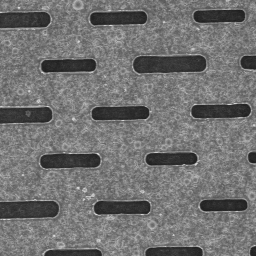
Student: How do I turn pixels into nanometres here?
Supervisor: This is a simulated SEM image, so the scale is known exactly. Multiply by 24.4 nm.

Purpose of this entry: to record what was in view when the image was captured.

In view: a regular array of holes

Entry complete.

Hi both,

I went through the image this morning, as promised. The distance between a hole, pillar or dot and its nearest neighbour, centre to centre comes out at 1.68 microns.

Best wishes